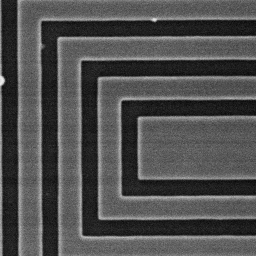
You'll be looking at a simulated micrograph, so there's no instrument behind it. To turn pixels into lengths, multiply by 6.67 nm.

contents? groups of lines, slits or small figures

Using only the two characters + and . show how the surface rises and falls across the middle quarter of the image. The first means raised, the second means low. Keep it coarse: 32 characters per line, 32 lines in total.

++++............................
++++............................
++++............................
++++.....+++++++++++++++++++++++
++++.....+++++++++++++++++++++++
++++.....+++++++++++++++++++++++
++++....++++++++++++++++++++++++
++++....++++++++++++++++++++++++
++++....++++++++++++++++++++++++
++++....++++++..................
++++....++++++..................
++++....++++++..................
++++....++++++..................
++++....++++++.....+++++++++++++
++++.....+++++.....+++++++++++++
++++.....+++++.....+++++++++++++
++++.....+++++.....+++++++++++++
++++.....+++++.....+++++++++++++
++++.....+++++.....+++++++++++++
++++.....+++++.....+++++++++++++
++++.....+++++.....+++++++++++++
++++.....+++++.....+++++++++++++
++++.....+++++.....+++++++++++++
++++.....+++++.....+++++++++++++
++++.....+++++.....+++++++++++++
++++.....+++++.....+++++++++++++
++++.....+++++.....+++++++++++++
++++.....+++++.....+++++++++++++
++++.....+++++.....+++++++++++++
++++.....+++++..................
++++.....+++++..................
++++.....+++++..................